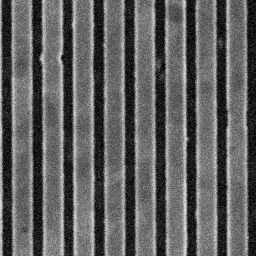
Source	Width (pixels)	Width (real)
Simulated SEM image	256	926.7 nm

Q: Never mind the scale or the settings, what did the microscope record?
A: parallel lines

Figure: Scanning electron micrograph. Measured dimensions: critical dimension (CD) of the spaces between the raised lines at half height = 0.0425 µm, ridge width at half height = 70.1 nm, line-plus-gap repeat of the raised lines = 111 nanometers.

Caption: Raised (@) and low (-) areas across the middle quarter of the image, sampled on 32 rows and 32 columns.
---@@@@---@@@@@---@@@@@---@@@@--
---@@@@---@@@@@---@@@@@---@@@@--
---@@@@---@@@@@---@@@@@---@@@@--
---@@@@---@@@@@---@@@@@---@@@@--
---@@@@---@@@@@---@@@@@---@@@@--
---@@@@---@@@@@---@@@@@---@@@@--
---@@@@---@@@@@---@@@@@---@@@@--
---@@@@---@@@@@---@@@@@---@@@@--
---@@@@---@@@@@---@@@@@---@@@@--
---@@@@---@@@@@---@@@@@---@@@@--
---@@@@---@@@@@---@@@@@---@@@@--
---@@@@---@@@@@---@@@@@---@@@@--
---@@@@---@@@@@---@@@@@---@@@@--
---@@@@---@@@@@---@@@@@---@@@@--
---@@@@---@@@@@---@@@@@---@@@@--
---@@@@---@@@@@---@@@@@---@@@@--
---@@@@---@@@@@---@@@@@---@@@@--
---@@@@---@@@@@---@@@@@---@@@@--
---@@@@---@@@@@---@@@@----@@@@--
---@@@@---@@@@@---@@@@@---@@@@--
---@@@@---@@@@@---@@@@@---@@@@--
---@@@@---@@@@@---@@@@@---@@@@--
---@@@@---@@@@@---@@@@@---@@@@--
---@@@@---@@@@@---@@@@@---@@@@--
---@@@@---@@@@@---@@@@@---@@@@--
---@@@@---@@@@@---@@@@@---@@@@--
---@@@@---@@@@@---@@@@@---@@@@--
---@@@@---@@@@@---@@@@@---@@@@--
---@@@@---@@@@@---@@@@@---@@@@--
---@@@@---@@@@@---@@@@@---@@@@--
---@@@@---@@@@@---@@@@@---@@@@--
---@@@@---@@@@@---@@@@@---@@@@--